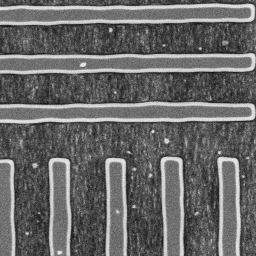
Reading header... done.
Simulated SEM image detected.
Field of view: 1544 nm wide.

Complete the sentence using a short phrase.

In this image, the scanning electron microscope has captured groups of lines, slits or small figures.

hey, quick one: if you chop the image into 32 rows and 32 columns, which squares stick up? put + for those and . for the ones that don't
................................
++++++++++++++++++++++++++++++++
++++++++++++++++++++++++++++.++.
................................
................................
................................
................................
++++++++++++++++++++++++++++++++
+++++++++++++++++++++++++++++++.
................................
................................
................................
................................
++++++++++++++++++++++++++++++++
++++++++++++++++++++++++++++++++
................................
................................
................................
................................
................................
+.....+++....++.....+++....+++..
++....+++....++.....+++.....++..
++....+++....++.....+++.....++..
++....+++....++.....+++.....++..
++....+++.....++....+++.....++..
++....+++.....++....+++.....++..
++....+++.....++....+++.....++..
++....+++.....++.....++.....++..
++....+++....+++.....++.....++..
++....+++....+++.....++.....++..
++....+++....+++.....++.....++..
++....+++....+++.....++.....++..